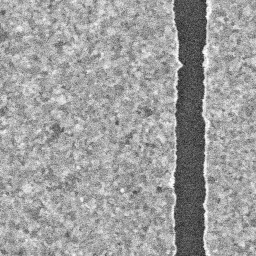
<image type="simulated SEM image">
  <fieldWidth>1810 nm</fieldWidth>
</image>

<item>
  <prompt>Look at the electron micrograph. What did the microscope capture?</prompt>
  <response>one or a few lines or trenches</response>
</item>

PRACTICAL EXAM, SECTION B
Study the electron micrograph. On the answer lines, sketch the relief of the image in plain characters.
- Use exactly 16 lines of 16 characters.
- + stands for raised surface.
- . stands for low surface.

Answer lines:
+++++++++++..+++
+++++++++++..+++
+++++++++++..+++
+++++++++++..+++
+++++++++++..+++
+++++++++++..+++
+++++++++++..+++
+++++++++++..+++
+++++++++++..+++
+++++++++++..+++
+++++++++++..+++
+++++++++++..+++
+++++++++++..+++
+++++++++++..+++
+++++++++++..+++
+++++++++++..+++